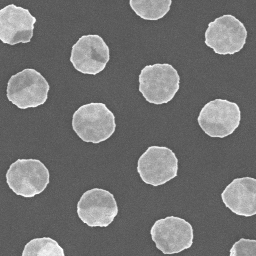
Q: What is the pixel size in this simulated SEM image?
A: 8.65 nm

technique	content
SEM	a regular array of raised bodies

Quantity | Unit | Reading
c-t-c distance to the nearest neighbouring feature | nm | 612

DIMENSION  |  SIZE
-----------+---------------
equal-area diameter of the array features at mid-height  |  342 nanometers